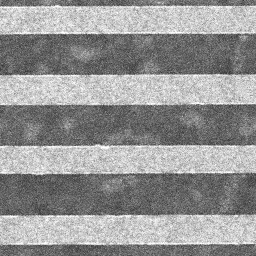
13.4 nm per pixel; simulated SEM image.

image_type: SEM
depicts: one or a few lines or trenches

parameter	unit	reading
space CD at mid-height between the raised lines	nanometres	560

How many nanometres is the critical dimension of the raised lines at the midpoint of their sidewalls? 372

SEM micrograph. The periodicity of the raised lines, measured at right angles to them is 0.939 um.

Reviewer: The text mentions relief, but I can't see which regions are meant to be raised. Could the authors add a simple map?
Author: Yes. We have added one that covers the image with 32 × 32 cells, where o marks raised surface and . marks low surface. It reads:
................................
oooooooooooooooooooooooooooooooo
oooooooooooooooooooooooooooooooo
oooooooooooooooooooooooooooooooo
..............................o.
................................
................................
................................
................................
oooooooooooooooooooooooooooooooo
oooooooooooooooooooooooooooooooo
oooooooooooooooooooooooooooooooo
oooooooooooooooooooooooooooooooo
................................
................................
................................
................................
................................
oooooooooooooooooooooooooooooooo
oooooooooooooooooooooooooooooooo
oooooooooooooooooooooooooooooooo
oooooooooooooooooooooooooooooooo
................................
................................
................................
................................
................................
oooooooooooooooooooooooooooooooo
oooooooooooooooooooooooooooooooo
oooooooooooooooooooooooooooooooo
.............................o..
................................